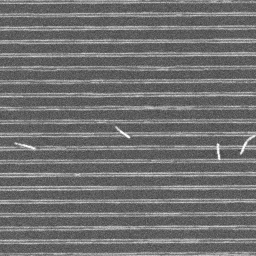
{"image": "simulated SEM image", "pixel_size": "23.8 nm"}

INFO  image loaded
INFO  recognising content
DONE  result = parallel lines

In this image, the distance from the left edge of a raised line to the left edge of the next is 317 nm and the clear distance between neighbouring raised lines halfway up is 0.253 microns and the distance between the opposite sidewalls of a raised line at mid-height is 62.4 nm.